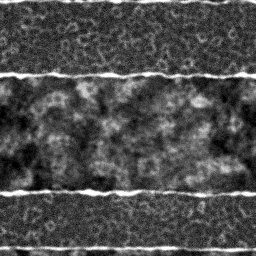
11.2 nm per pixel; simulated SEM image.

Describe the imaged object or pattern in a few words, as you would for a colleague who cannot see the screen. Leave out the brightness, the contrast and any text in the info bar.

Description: one or a few lines or trenches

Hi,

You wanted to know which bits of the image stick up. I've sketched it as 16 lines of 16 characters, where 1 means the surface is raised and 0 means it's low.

1111111111111111
1111111111111111
1111111111111111
1111111111111111
1111111111111111
0000000000000000
0000000000000000
0000000000000000
0000000000000000
0000000000000000
0000000000000000
0000000000000000
1111111111111111
1111111111111111
1111111111111111
1111111111011111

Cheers